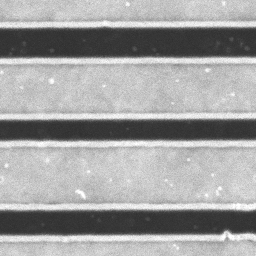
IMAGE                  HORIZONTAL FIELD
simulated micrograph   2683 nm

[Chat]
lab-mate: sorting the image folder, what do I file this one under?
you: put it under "one or a few lines or trenches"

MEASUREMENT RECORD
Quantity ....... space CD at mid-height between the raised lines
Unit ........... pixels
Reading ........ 58.3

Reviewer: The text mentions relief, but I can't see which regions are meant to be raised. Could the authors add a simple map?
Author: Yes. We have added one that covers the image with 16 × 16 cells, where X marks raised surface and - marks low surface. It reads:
----------------
------XXXXXXXXXX
XXXXXXXXXXXXXXXX
XXXXXXXXXXXXXXXX
----------------
----------------
----------------
XXXXXXXXXXXXXXXX
XXXXXXXXXXXXXXXX
----------------
----------------
----------------
----------------
XXXXXXXXXXXXXXXX
XXXXXXXXXXXXXXXX
----------------